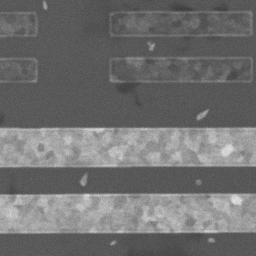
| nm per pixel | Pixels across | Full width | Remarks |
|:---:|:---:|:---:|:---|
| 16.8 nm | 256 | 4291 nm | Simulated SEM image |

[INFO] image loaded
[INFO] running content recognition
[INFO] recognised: wiring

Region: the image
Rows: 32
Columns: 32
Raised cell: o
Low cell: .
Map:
................................
................................
oooo..........ooooooooooooooooo.
oooo..........ooooooooooooooooo.
................................
................................
................................
oooo..........ooooooooooooooooo.
ooooo.........ooooooooooooooooo.
ooooo.........ooooooooooooooooo.
................................
................................
................................
................................
................................
................................
oooooooooooooooooooooooooooooooo
oooooooooooooooooooooooooooooooo
oooooooooooooooooooooooooooooooo
oooooooooooooooooooooooooooooooo
oooooooooooooooooooooooooooooooo
................................
................................
................................
oooooooooooooooooooooooooooooooo
oooooooooooooooooooooooooooooooo
oooooooooooooooooooooooooooooooo
oooooooooooooooooooooooooooooooo
oooooooooooooooooooooooooooooooo
................................
................................
................................